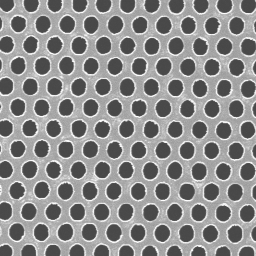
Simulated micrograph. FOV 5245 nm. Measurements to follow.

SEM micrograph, a regular array of holes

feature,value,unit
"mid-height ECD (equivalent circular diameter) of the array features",326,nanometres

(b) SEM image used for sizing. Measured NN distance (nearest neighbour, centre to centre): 486 nm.